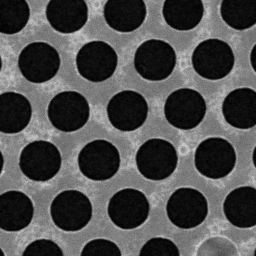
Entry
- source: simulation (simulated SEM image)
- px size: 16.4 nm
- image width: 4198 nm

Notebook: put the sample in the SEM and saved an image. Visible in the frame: a regular array of holes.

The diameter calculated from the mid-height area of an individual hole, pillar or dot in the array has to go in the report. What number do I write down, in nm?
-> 690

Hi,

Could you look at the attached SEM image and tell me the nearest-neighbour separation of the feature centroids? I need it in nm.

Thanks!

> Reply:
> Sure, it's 933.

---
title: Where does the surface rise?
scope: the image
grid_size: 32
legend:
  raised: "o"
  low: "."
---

...ooo.....oo.....oo.....ooo....
....oo.....oo.....oo.....ooo....
....oo.....oo.....ooo....ooo....
...oooo...oooo...ooooo..ooooo..o
oooooooooooooooooooooooooooooooo
oooo..ooooo..ooooo...oooo...oooo
ooo....ooo....ooo.....oo.....oo.
oo......o......oo.....oo.....oo.
oo.....ooo.....oo.....oo.....ooo
ooo....ooo....oooo...oooo...oooo
oooooooooooooooooooooooooooooooo
o.oooooo..ooooo..ooooo...oooo...
...ooo.....ooo....ooo.....oo....
....oo.....oo......oo.....oo....
....oo.....oo.....ooo.....oo....
....oo.....ooo....ooo....oooo...
..oooooo.ooooooooooooooooooooooo
oooooooooooo.ooooo...ooooo..oooo
ooo....ooo.....oo.....ooo....ooo
oo......oo.....oo.....oo......oo
oo......oo.....oo.....oo.....ooo
ooo....ooo.....oo.....ooo....ooo
oooo..oooooo.oooooo.oooooooooooo
ooooooooooooooooooooooo.oooooo..
...oooo....ooo....ooo....ooo....
....oo.....ooo.....oo.....oo....
....oo......o......oo.....oo....
....ooo....ooo....ooo.....oo....
...oooo...ooooo..oooooo.oooooo.o
oooooooooooooooooooooooooooooooo
oooo...oooo...oooo....oooooooooo
ooo.....oo.....oo.....oooooooooo